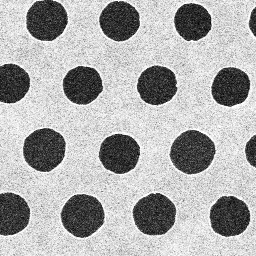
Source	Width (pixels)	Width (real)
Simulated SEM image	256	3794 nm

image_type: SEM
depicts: a regular array of holes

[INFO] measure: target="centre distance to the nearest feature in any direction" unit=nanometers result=1080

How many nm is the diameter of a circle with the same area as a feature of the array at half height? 607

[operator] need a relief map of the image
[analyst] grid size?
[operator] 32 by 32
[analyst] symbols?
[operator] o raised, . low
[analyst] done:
oooo....oooooo..ooooooo..ooooooo
ooo.....ooooo....ooooo....ooooo.
ooo......ooo......oooo....ooooo.
ooo.....ooooo....ooooo....ooooo.
oooo...oooooo....oooooo...oooooo
oooooooooooooooooooooooooooooooo
oooooooooooooooooooooooooooooooo
oooooooooooooooooooooooooooooooo
...oooooo...ooooooo..ooooooo..oo
....oooo.....oooo.....ooooo....o
....oooo.....oooo.....ooooo....o
...ooooo.....oooo.....oooo.....o
...oooooo...oooooo...oooooo....o
oooooooooooooooooooooooooooooooo
oooooooooooooooooooooooooooooooo
oooooooooooooooooooooooooooooooo
oooo...oooooooooooooooo..ooooooo
ooo.....ooooo....ooooo....ooooo.
ooo.....oooo.....oooo......oooo.
ooo.....oooo.....oooo......oooo.
ooo.....ooooo....ooooo....ooooo.
ooooo.oooooooo..ooooooo..ooooooo
oooooooooooooooooooooooooooooooo
oooooooooooooooooooooooooooooooo
...oooooo..ooooooo...ooooooo.ooo
...ooooo.....oooo.....ooooo....o
....oooo.....oooo.....oooo.....o
....oooo.....oooo.....oooo.....o
...ooooo....ooooo....ooooo.....o
ooooooooo..ooooooooooooooooo.ooo
oooooooooooooooooooooooooooooooo
oooooooooooooooooooooooooooooooo